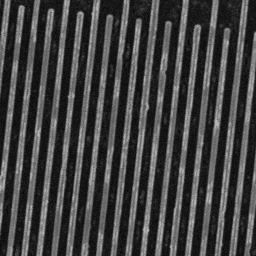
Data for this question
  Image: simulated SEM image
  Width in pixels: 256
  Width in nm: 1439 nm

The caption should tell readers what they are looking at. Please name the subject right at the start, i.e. parallel lines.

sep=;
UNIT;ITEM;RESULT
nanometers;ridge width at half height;32.8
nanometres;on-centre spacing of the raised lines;83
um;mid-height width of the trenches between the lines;0.0489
